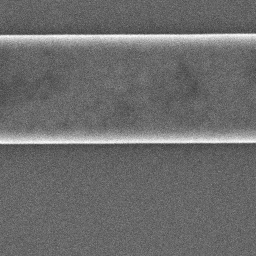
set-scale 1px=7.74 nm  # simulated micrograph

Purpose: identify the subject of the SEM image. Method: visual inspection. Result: wiring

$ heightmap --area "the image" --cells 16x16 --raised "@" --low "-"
----------------
----------------
@@@@@@@@@@@@@@@@
@@@@@@@@@@@@@@@@
@@@@@@@@@@@@@@@@
@@@@@@@@@@@@@@@@
@@@@@@@@@@@@@@@@
@@@@@@@@@@@@@@@@
@@@@@@@@@@@@@@@@
----------------
----------------
----------------
----------------
----------------
----------------
----------------